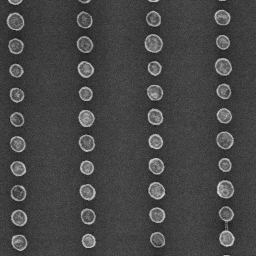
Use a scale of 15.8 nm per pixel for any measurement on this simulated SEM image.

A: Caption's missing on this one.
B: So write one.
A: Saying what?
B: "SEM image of a regular array of raised bodies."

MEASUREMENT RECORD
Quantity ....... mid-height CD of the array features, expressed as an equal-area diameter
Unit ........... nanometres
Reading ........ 232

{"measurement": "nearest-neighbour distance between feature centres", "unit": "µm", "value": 0.385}